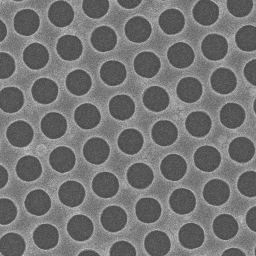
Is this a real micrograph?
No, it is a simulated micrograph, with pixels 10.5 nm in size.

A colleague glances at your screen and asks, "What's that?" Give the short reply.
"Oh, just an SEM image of a regular array of holes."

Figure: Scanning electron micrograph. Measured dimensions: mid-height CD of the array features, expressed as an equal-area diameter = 278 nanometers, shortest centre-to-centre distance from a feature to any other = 364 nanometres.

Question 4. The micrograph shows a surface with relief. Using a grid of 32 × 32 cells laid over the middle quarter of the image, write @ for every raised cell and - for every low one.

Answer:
@@@@@@@@@------@@-------@@@----@
@@@--@@@@------@@@------@@@@@@@@
@-----@@@-------@@-----@@@@@@@@@
@------@@------@@@@@--@@@@@@@@--
-------@@@-----@@@@@@@@@@@@@@---
@------@@@@@@@@@@@@@@@-@@@@@----
@-----@@@@@@@@@@@@@@-----@@@----
@@---@@@@@@@@@@@@@@@------@@----
@@@@@@@@@@@@-----@@@------@@@---
@@@@@@@@@@@-------@@------@@@@--
@@@@----@@@-------@@------@@@@@@
@@@------@@-------@@@----@@@@@@@
@@-------@@@-----@@@@@@@@@@@@@@-
@@-------@@@----@@@@@@@@@@@@@@@-
-@@------@@@@@@@@@@@@@@----@@@--
-@@@----@@@@@@@@@@@@@@------@@--
-@@@@@@@@@@@@@@---@@@@------@@@-
@@@@@@@@@@@@@@-----@@@-------@@@
@@@@@@@--@@@@-------@@------@@@@
@@@@@@-----@@-------@@@-----@@@@
@@@@@------@@@------@@@@--@@@@@@
--@@@------@@@-----@@@@@@@@@@@@@
---@@------@@@@@--@@@@@@@@@-@@@@
---@@------@@@@@@@@@@@@@@-----@@
---@@@----@@@@@@@@@@@@@@-------@
---@@@@@@@@@@@@@@----@@@-------@
--@@@@@@@@@@@@@@------@@-------@
@@@@@@@@----@@@@------@@------@@
@@@@@@@------@@@------@@@----@@@
---@@@@-------@@------@@@@@@@@@@
-----@@-------@@@----@@@@@@@@@@@
-----@@-------@@@@@@@@@@@@@@---@